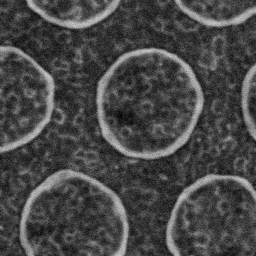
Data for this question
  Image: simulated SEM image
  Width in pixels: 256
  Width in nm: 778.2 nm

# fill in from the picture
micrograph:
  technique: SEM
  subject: raised bodies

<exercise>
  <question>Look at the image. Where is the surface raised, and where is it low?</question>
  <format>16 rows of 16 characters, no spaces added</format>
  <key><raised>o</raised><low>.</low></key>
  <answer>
..ooooo....ooooo
....o...........
................
oo......ooo.....
ooo....ooooo....
ooo...oooooo...o
ooo...oooooo...o
ooo...oooooo...o
oo.....ooooo....
........oo......
................
...ooo......ooo.
..ooooo....ooooo
..oooooo...ooooo
.ooooooo...ooooo
..oooooo...ooooo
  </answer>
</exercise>